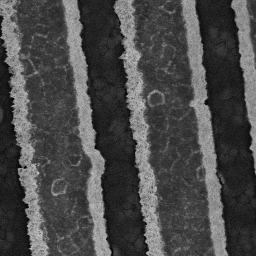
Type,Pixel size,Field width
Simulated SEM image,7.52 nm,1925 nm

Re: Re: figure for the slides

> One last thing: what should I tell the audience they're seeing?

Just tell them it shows one or a few lines or trenches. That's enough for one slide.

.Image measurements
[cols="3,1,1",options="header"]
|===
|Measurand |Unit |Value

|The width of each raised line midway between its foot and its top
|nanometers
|481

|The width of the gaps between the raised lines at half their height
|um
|0.394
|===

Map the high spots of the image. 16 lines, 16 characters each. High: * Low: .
.***....****...*
*****...****...*
.****...****...*
.****...****...*
.****...****....
.****...****....
.****....***....
.****....****...
.****....****...
..****...****...
..****...****...
..****...****...
..****...****...
..****....***...
..****....****..
..****....****..